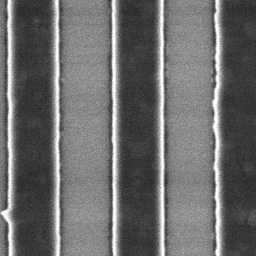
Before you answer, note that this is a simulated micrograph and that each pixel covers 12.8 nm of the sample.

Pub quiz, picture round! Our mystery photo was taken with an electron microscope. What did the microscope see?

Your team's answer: one or a few lines or trenches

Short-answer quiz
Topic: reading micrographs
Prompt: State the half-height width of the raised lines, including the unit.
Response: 49.4 pixels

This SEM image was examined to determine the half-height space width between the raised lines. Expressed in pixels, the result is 54.2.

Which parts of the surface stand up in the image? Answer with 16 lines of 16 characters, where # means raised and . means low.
.###...###....##
.###...###...###
.###...###....##
.###...###....##
.###...###....##
.###...###....##
.###...###...###
.###...###...###
.###...###....##
.###...###....##
.###...###...###
.###...###....##
.###...###....##
####...###....##
.###...###....##
.###...###....##